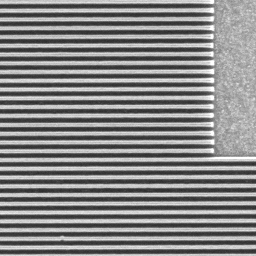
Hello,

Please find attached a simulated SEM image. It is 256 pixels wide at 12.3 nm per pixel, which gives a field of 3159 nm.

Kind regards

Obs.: parallel lines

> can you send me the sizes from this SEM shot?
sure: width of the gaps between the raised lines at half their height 60.1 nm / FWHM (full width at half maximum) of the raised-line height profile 47.8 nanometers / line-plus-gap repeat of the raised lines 108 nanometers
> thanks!